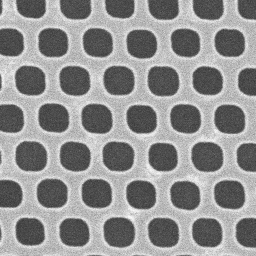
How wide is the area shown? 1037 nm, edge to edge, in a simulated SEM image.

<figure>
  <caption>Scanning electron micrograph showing a regular array of holes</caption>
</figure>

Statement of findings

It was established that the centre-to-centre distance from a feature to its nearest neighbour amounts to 43.1 pixels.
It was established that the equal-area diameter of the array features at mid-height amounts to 127 nm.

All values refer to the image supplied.